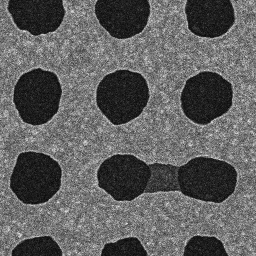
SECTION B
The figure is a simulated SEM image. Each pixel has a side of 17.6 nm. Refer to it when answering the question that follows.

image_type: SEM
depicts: holes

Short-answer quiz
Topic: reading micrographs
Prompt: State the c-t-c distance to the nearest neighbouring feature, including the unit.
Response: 1.46 µm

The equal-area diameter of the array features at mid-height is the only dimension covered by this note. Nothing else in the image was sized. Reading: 52.4 pixels